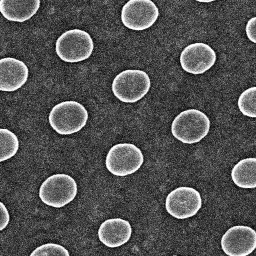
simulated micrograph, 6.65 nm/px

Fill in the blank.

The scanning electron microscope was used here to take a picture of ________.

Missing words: a regular array of raised bodies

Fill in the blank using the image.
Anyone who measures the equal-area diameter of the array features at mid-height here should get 228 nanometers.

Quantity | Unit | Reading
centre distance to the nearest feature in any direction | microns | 0.465